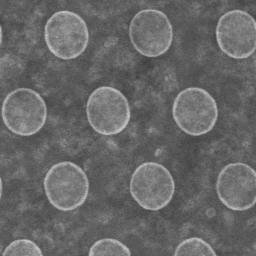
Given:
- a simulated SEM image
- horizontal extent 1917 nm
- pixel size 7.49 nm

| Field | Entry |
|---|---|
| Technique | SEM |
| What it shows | raised bodies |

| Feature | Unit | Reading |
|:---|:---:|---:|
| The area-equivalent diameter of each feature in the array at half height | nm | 329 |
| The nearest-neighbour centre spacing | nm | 634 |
